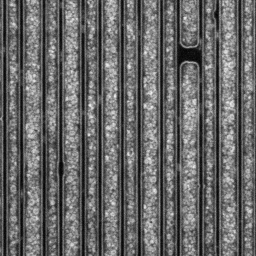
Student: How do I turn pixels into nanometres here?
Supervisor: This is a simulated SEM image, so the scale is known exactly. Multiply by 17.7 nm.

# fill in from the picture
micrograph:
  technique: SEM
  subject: parallel lines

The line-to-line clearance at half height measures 227 nm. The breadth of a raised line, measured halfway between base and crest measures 81.7 nm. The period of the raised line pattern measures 346 nm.